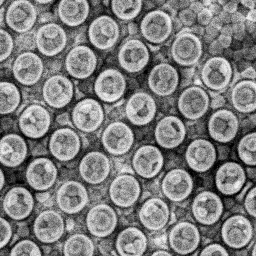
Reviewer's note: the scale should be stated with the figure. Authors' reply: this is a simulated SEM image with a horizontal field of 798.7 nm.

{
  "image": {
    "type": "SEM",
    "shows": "a regular array of raised bodies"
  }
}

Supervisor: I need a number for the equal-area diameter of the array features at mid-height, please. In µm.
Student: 0.0922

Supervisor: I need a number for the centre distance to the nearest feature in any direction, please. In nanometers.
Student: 116